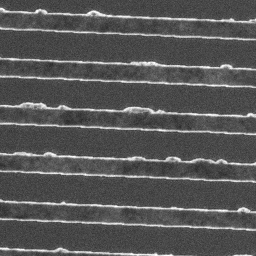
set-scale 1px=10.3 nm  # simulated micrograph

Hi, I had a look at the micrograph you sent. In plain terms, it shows lines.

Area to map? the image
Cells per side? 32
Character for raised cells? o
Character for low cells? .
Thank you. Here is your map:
................................
o...oo.....o....................
oooooooooooooooooooooooo........
oooooooooooooooooooooooooooooooo
.....................ooooooooooo
................................
................................
ooooo...........................
ooooooooooooooooooooooooooooo...
oooooooooooooooooooooooooooooooo
.......................ooooooooo
................................
................................
oooooo.oo.......oo..............
oooooooooooooooooooooooooooooooo
..oooooooooooooooooooooooooooooo
..........................oooooo
................................
................................
ooooooo.........................
oooooooooooooooooooooooooooooo.o
..oooooooooooooooooooooooooooooo
.........................ooooooo
................................
................................
ooooooo.........................
oooooooooooooooooooooooooooooooo
..oooooooooooooooooooooooooooooo
..........................oooooo
................................
................................
ooooooooo.......................